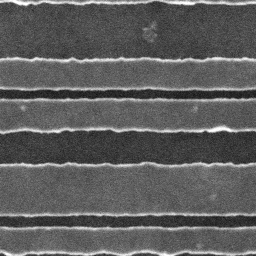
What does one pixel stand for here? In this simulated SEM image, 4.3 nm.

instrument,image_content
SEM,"lines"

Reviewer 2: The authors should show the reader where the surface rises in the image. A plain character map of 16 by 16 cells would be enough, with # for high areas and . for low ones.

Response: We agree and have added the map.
................
................
................
................
################
################
################
################
................
................
################
################
################
################
################
################